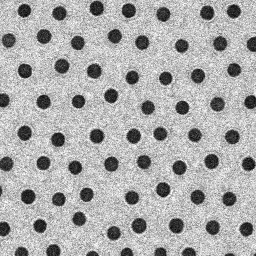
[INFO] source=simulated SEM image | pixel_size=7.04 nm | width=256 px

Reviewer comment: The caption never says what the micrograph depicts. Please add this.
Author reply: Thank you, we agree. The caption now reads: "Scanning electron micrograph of a regular array of holes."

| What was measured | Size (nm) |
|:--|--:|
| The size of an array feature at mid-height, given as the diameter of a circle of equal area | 103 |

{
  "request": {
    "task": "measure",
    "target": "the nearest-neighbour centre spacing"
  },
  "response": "0.207 microns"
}